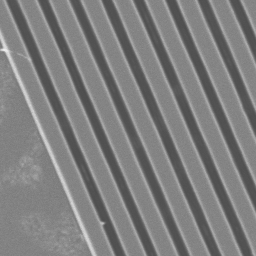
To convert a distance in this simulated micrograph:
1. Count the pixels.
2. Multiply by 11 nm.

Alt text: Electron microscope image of parallel lines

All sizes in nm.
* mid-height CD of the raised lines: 221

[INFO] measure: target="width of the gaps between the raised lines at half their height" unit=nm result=105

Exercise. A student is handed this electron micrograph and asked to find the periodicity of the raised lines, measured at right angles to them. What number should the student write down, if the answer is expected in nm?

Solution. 324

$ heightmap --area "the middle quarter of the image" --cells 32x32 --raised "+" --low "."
+..+++++...+++++...+++++...+++++
+...+++++..++++++...+++++...++++
++..+++++...+++++...+++++...++++
++..++++++..++++++..++++++..++++
++...+++++...+++++...+++++...+++
+++..++++++..++++++..++++++..+++
+++..++++++...+++++...+++++...++
+++...+++++...+++++...+++++...++
++++..++++++...+++++...+++++...+
++++...+++++...+++++...+++++...+
+++++..++++++..++++++..++++++..+
+++++...+++++...+++++...+++++...
++++++..++++++..++++++..++++++..
.+++++...+++++...+++++...+++++..
.+++++...+++++...+++++...+++++..
..+++++..++++++...+++++...+++++.
..+++++...+++++...+++++...+++++.
..++++++..++++++..++++++..++++++
...+++++...+++++...+++++...+++++
+..++++++..++++++..++++++..+++++
+...+++++...+++++...+++++...++++
++..+++++...+++++...+++++...++++
++...+++++..++++++...+++++...+++
++...+++++...+++++...+++++...+++
+++...+++++..++++++..++++++..+++
+++...+++++...+++++...+++++...++
++++..++++++..++++++..++++++..++
++++...+++++...+++++...+++++...+
+++++..+++++...+++++...+++++...+
+++++...+++++..++++++..++++++...
+++++...+++++...+++++...+++++...
.+++++...+++++..++++++..++++++..